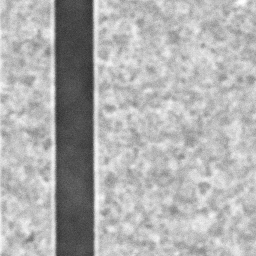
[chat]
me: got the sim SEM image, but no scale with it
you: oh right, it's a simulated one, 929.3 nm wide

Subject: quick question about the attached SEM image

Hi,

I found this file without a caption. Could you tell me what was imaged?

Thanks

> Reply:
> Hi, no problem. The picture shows one or a few lines or trenches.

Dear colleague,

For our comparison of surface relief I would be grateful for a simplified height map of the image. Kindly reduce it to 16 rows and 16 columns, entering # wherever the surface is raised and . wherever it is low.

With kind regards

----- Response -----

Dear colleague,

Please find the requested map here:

###...##########
###...##########
###...##########
###...##########
###...##########
###...##########
###...##########
###...##########
###...##########
###...##########
###...##########
###...##########
###...##########
###...##########
###...##########
###...##########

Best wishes